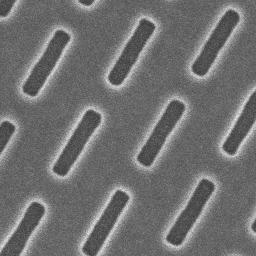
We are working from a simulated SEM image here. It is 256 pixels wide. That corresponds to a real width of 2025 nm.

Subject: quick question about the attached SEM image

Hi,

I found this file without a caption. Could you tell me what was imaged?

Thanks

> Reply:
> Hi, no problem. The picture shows holes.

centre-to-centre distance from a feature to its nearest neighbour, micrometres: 0.67